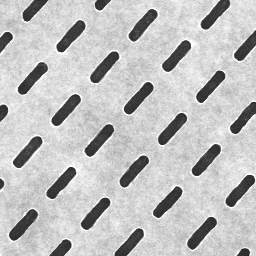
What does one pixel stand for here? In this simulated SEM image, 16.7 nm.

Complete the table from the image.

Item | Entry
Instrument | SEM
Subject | a regular array of holes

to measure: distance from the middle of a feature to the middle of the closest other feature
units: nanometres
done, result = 760